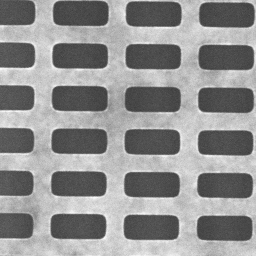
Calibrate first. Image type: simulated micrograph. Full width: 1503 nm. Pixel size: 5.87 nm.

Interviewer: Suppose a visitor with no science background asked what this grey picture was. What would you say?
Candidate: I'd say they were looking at groups of lines, slits or small figures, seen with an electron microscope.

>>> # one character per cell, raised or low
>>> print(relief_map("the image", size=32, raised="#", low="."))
....###......###......###......#
.....##.......##.......##.......
....###.......##.......##.......
############################...#
################################
....###......####....###########
.....#........##.......##.......
....##........##.......##.......
....###......###......###......#
################################
################################
....##.......###.......##.......
....##........##.......##.......
....###......###......###.......
################################
################################
....###......###......###......#
....##.......###.......##.......
....##.......###......###.......
############################..##
################################
....###......####....###########
....##.......###......###.......
....##.......###......###.......
...####......###......###......#
################################
################################
....##.......###......###.......
....##.......##.......###.......
....##.......###......###.......
################################
################################